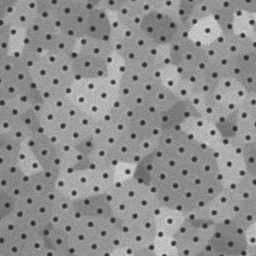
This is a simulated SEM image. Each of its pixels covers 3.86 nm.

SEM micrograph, a regular array of holes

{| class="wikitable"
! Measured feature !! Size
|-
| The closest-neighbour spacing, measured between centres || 60.3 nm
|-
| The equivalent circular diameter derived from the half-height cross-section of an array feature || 5.85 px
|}